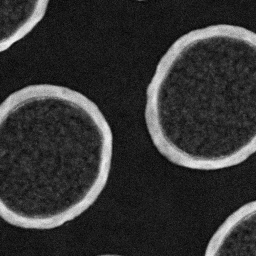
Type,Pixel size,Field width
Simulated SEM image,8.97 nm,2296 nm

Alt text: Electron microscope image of raised bodies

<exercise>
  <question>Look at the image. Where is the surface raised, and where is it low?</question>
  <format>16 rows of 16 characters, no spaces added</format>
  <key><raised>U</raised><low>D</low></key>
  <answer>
UUUDDDDDDDDDDDDD
UUDDDDDDDDDDDDDD
UDDDDDDDDDDDUUUU
DDDDDDDDDDDUUUUU
DDDDDDDDDDUUUUUU
DDDDDDDDDDUUUUUU
DUUUUDDDDDUUUUUU
UUUUUUDDDDUUUUUU
UUUUUUUDDDUUUUUU
UUUUUUUDDDDUUUUD
UUUUUUUDDDDDDDDD
UUUUUUDDDDDDDDDD
UUUUUUDDDDDDDDDD
DUUUDDDDDDDDDDDU
DDDDDDDDDDDDDDUU
DDDDDDDDDDDDDUUU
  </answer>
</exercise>